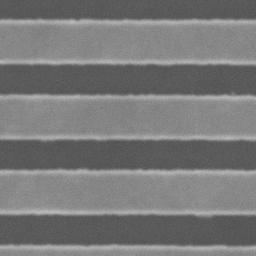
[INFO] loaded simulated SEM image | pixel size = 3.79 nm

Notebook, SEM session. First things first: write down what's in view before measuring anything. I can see lines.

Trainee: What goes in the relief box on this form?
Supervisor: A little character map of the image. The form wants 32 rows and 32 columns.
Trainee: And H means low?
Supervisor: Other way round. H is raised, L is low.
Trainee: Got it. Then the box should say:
LLLLLLLLLLLLLLLLLLLLLLLLLLLLLLLL
LLLLLLLLLLLLLLLLLLLLLLLLLLLLLLLL
LHLLLLLLLLLHLLLLLLLLLLLLHLLLLLLL
HHHHHHHHHHHHHHHHHHHHHHHHHHHHHHHH
HHHHHHHHHHHHHHHHHHHHHHHHHHHHHHHH
HHHHHHHHHHHHHHHHHHHHHHHHHHHHHHHH
HHHHHHHHHHHHHHHHHHHHHHHHHHHHHHHH
HHHHHHHHHHHHHHHHHHHHHHHHHHHHHHHH
LLLLLLLLLLLLLLLLLLLLLLLLLLLLLLLL
LLLLLLLLLLLLLLLLLLLLLLLLLLLLLLLL
LLLLLLLLLLLLLLLLLLLLLLLLLLLLLLLL
LLLLLLLLLLLLLLLLLLLLLLLLLLLLLLLL
HHHHHHHHHHHHHHHHHHHHHHHHHHHHHHHH
HHHHHHHHHHHHHHHHHHHHHHHHHHHHHHHH
HHHHHHHHHHHHHHHHHHHHHHHHHHHHHHHH
HHHHHHHHHHHHHHHHHHHHHHHHHHHHHHHH
HHHHHHHHHHHHHHHHHHHHHHHHHHHHHHHH
LLLLLLLLLLLLLLLLLLLLLLLLLLLLLLLL
LLLLLLLLLLLLLLLLLLLLLLLLLLLLLLLL
LLLLLLLLLLLLLLLLLLLLLLLLLLLLLLLL
LLLLLLLLLLLLLLLLLLLLLLLLLLLLLLLL
HHHHHHHHHHHHHHHHHHHHHHHHHHHHHHHH
HHHHHHHHHHHHHHHHHHHHHHHHHHHHHHHH
HHHHHHHHHHHHHHHHHHHHHHHHHHHHHHHH
HHHHHHHHHHHHHHHHHHHHHHHHHHHHHHHH
HHHHHHHHHHHHHHHHHHHHHHHHHHHHHHHH
HHHHHHHHHHHHHHHHHHHHHHHHHHHHHHHH
LLLLLLLLLLLLLLLLLLLLLLLLLLLLLLLL
LLLLLLLLLLLLLLLLLLLLLLLLLLLLLLLL
LLLLLLLLLLLLLLLLLLLLLLLLLLLLLLLL
LLLLLLLLLLLLLLLLLLLLLLLLLLLLLLLL
HHHHHHHHHHHHHHHHHHHHHHHHHHHHHHHH